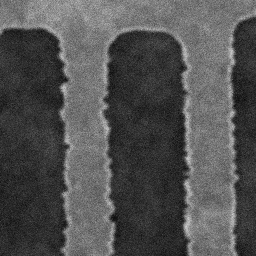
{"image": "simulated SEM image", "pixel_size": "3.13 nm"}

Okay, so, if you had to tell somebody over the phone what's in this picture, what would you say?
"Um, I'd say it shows one or a few lines or trenches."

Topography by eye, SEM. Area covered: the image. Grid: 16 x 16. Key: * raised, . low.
****************
***************.
....***....***..
....***.....***.
....***.....**..
....***.....**..
....**......***.
....***.....**..
....***.....**..
....***.....***.
....***.....***.
....***.....***.
....***.....***.
....***.....***.
....***.....***.
....***.....***.